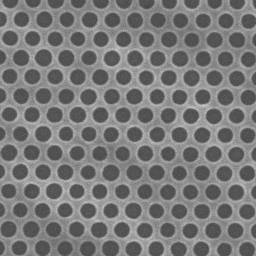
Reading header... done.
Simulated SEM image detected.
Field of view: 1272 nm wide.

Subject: a regular array of holes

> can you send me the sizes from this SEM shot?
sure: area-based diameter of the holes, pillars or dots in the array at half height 16.2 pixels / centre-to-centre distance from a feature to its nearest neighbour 109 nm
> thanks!